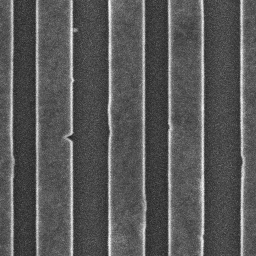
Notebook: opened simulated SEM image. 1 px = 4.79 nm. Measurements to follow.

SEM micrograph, one or a few lines or trenches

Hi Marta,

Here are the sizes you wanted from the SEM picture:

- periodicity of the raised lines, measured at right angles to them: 315 nanometres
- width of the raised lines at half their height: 167 nanometres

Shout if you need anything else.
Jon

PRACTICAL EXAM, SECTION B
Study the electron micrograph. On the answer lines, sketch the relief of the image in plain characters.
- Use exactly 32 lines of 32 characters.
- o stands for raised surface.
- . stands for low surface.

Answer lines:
o....oooo.....oooo...oooo.....oo
o....oooo.....oooo...oooo.....oo
o....oooo.....oooo...oooo.....oo
o....oooo.....oooo...oooo.....oo
o....oooo.....oooo...oooo.....oo
o....oooo.....oooo...oooo.....oo
o....oooo.....oooo...oooo.....oo
o....oooo.....oooo...oooo.....oo
oo...oooo.....oooo...oooo.....oo
oo...oooo.....oooo...oooo.....oo
o....oooo.....oooo...oooo.....oo
o....oooo.....oooo...oooo.....oo
o....oooo.....oooo...oooo.....oo
o....oooo.....oooo...oooo.....oo
o....oooo.....oooo...oooo.....oo
o....oooo.....oooo...oooo.....oo
o....oooo.....oooo...oooo.....oo
o....oooo.....oooo...oooo.....oo
o....oooo.....oooo...oooo.....oo
oo...oooo.....oooo...oooo.....oo
oo...oooo.....oooo...oooo.....oo
oo...oooo.....oooo...oooo.....oo
oo...oooo.....oooo...oooo.....oo
o....oooo.....oooo...oooo.....oo
oo...oooo.....oooo...oooo.....oo
oo...oooo.....oooo...oooo.....oo
oo...oooo.....oooo...oooo.....oo
oo...oooo.....oooo...oooo.....oo
oo...oooo.....oooo...oooo.....oo
oo...oooo.....oooo...oooo.....oo
o....oooo.....oooo...oooo.....oo
oo...oooo.....oooo...oooo.....oo